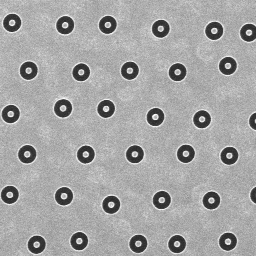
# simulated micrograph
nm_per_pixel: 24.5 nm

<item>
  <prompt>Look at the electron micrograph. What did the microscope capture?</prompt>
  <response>a regular array of ring-shaped grooves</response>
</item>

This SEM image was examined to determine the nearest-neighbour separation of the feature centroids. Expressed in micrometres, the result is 1.06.